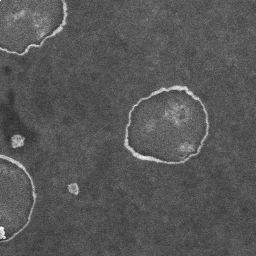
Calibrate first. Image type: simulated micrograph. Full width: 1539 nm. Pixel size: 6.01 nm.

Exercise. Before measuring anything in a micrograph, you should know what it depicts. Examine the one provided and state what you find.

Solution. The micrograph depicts holes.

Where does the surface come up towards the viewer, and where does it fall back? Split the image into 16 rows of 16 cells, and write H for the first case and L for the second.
LLLLHHHHHHHHHHHH
LLLLHHHHHHHHHHHH
LLLHHHHHHHHHHHHH
HHHHHHHHHHHHHHHH
HHHHHHHHHHHHHHHH
HHHHHHHHHHHHHHHH
HHHHHHHHHLLLLHHH
HHHHHHHHLLLLLHHH
HHHHHHHHLLLLLHHH
HHHHHHHHHLLLHHHH
LHHHHHHHHHHHHHHH
LLHHHHHHHHHHHHHH
LLHHHHHHHHHHHHHH
LLHHHHHHHHHHHHHH
LHHHHHHHHHHHHHHH
HHHHHHHHHHHHHHHH